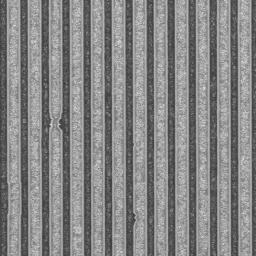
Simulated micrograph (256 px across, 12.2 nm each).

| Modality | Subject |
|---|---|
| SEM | parallel lines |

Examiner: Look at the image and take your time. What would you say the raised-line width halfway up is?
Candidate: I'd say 0.155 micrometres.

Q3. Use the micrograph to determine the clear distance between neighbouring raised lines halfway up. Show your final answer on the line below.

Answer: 103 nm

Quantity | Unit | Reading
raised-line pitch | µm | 0.255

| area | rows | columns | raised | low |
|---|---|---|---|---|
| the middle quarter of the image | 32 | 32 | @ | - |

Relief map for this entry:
--@@@--@@@--@@@---@@---@@@--@@@-
--@@@--@@@--@@@---@@---@@@--@@@-
--@@@--@@@--@@@---@@---@@@--@@@-
--@@@--@@@--@@@---@@---@@@--@@@-
--@@@--@@@--@@@---@@---@@@--@@@-
--@@@--@@@--@@@---@@---@@@--@@@-
--@@@--@@@--@@@---@@---@@@--@@@-
--@@@--@@@--@@@---@@---@@@--@@@-
--@@@--@@@--@@@---@@---@@@--@@@-
--@@@--@@@--@@@---@@---@@@--@@@-
--@@@--@@@--@@@---@@---@@@--@@@-
--@@@--@@@--@@@---@@---@@@--@@@-
--@@@--@@@--@@@---@@---@@@--@@@-
--@@@--@@@--@@@---@@---@@@--@@@-
--@@@--@@@--@@@---@@---@@@--@@@-
--@@@--@@@--@@@---@@---@@@--@@@-
--@@@--@@@--@@@---@@---@@@--@@@-
--@@@--@@@--@@@---@@---@@@--@@@-
--@@@--@@@--@@@---@@---@@@--@@@-
--@@@--@@@--@@@---@@---@@@--@@@-
--@@@--@@@--@@@---@@---@@@--@@@-
--@@@--@@@--@@@---@@---@@@--@@@-
--@@@--@@@--@@@---@@---@@@--@@@-
--@@@--@@@--@@@--@@@---@@@--@@@-
--@@@--@@@--@@@---@@---@@@--@@@-
--@@@--@@@--@@@---@@---@@@--@@@-
--@@@--@@@--@@@---@@---@@@--@@@-
--@@@--@@@--@@@---@@---@@@--@@@-
--@@@--@@@--@@@---@@---@@@--@@@-
--@@@--@@@--@@@---@@---@@@--@@@-
--@@@--@@@--@@@---@@---@@@--@@@-
--@@@--@@@--@@@---@@---@@@--@@@-